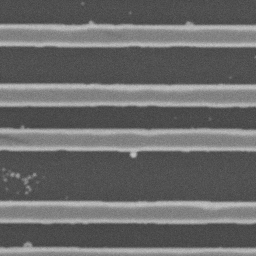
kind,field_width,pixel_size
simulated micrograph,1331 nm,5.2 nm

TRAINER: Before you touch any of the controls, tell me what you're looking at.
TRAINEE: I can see lines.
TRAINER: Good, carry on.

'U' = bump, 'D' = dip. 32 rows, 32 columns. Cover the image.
DDDDDDDDDDDDDDDDDDDDDDDDDDDDDDDD
DDDDDDDDDDDDDDDDDDDDDDDDDDDDDDDD
DDDDDDDDDDDDDDDDDDDDDDDDDDDDDDDD
UUUUUUUUUUUUUUUUUUUUUUUUUUUUUUUU
UUUUUUUUUUUUUUUUUUUUUUUUUUUUUUUU
UUUUUUUUUUUUUUUUUUUUUUUUUUUUUUUU
DDDDDDDDDDDDDDDDDDDDDDDDDDDDDDDD
DDDDDDDDDDDDDDDDDDDDDDDDDDDDDDDD
DDDDDDDDDDDDDDDDDDDDDDDDDDDDDDDD
DDDDDDDDDDDDDDDDDDDDDDDDDDDDDDDD
DDDDDDDDDDDDDDDDDDDDDDDDDDDDDDDD
UUUUUUUUUUUUUUUUUUUUUUUUUUUUUUUU
UUUUUUUUUUUUUUUUUUUUUUUUUUUUUUUU
DDDDDDDDDDDDDDDDDDDDDDDDDDDDDDDD
DDDDDDDDDDDDDDDDDDDDDDDDDDDDDDDD
DDDDDDDDDDDDDDDDDDDDDDDDDDDDDDDD
UUUUUUUUUUUUUUUUUUUUUUUUUUUUUUUU
UUUUUUUUUUUUUUUUUUUUUUUUUUUUUUUU
UUUUUUUUUUUUUUUUUUUUUUUUUUUUUUUU
DDDDDDDDDDDDDDDDDDDDDDDDDDDDDDDD
DDDDDDDDDDDDDDDDDDDDDDDDDDDDDDDD
DDDDDDDDDDDDDDDDDDDDDDDDDDDDDDDD
DDDDDDDDDDDDDDDDDDDDDDDDDDDDDDDD
DDDDDDDDDDDDDDDDDDDDDDDDDDDDDDDD
DDDDDDDDDDDDDDDDDDDDDDDDDDDDDDDD
UUUUUUUUUUUUUUUUUUUUUUUUUUDUUUUU
UUUUUUUUUUUUUUUUUUUUUUUUUUUUUUUU
UUUUUUUUUUUUUUUUUUUUUUUUUUUUUUUU
DDDDDDDDDDDDDDDDDDDDDDDDDDDDDDDD
DDDDDDDDDDDDDDDDDDDDDDDDDDDDDDDD
DDDDDDDDDDDDDDDDDDDDDDDDDDDDDDDD
UUUUUUUUUUUUUUUUUUUUUUUUUUUUUUUU